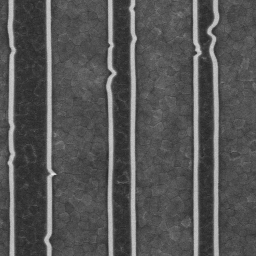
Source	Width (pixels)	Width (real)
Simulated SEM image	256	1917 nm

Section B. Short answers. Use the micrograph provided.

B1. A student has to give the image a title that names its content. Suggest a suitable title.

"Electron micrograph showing one or a few lines or trenches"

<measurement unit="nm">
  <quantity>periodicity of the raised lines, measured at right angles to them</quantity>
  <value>656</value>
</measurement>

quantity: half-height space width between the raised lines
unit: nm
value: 462